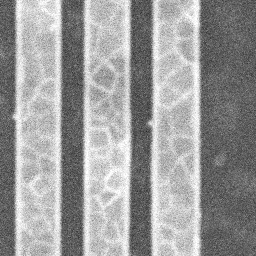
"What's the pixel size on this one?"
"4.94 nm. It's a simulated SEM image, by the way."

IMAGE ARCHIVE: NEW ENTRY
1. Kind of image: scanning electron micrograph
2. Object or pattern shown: one or a few lines or trenches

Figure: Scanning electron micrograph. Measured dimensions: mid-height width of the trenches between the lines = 28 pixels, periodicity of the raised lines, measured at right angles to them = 340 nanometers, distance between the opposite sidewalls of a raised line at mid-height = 199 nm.